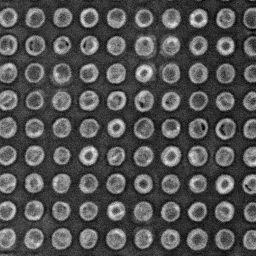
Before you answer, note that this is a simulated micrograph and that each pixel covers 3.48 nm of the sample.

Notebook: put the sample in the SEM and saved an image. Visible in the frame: a regular array of raised bodies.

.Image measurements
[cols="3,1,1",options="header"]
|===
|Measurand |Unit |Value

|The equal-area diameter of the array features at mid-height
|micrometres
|0.0637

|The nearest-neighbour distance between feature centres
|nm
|94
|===